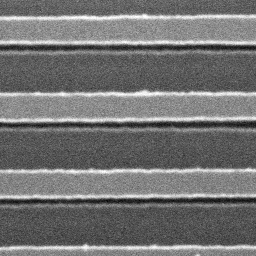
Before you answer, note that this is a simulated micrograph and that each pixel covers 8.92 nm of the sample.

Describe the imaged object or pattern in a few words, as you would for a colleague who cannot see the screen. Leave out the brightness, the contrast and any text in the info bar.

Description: lines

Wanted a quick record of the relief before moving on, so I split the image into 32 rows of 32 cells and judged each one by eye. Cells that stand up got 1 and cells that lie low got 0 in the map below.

00000000000000000000000000000000
00000000000000000000000000000000
11111111111111111111111111111111
11111111111111111111111111111111
11111111111111111111111111111111
00000000000000000000000000000000
00000000000000000000000000000000
00000000000000000000000000000000
00000000000000000000000000000000
00000000000000000000000000000000
00000000000000000000000000000000
00000000000000000000000000000000
11111111111111111111111111111111
11111111111111111111111111111111
11111111111111111111111111111111
00000000000000000000000000000000
00000000000000000000000000000000
00000000000000000000000000000000
00000000000000000000000000000000
00000000000000000000000000000000
00000000000000000000000000000000
11111111111111111111111111111111
11111111111111111111111111111111
11111111111111111111111111111111
11111111111111111111110100111000
00000000000000000000000000000000
00000000000000000000000000000000
00000000000000000000000000000000
00000000000000000000000000000000
00000000000000000000000000000000
00000000000000000000000000000000
11111111111111111111111111111111